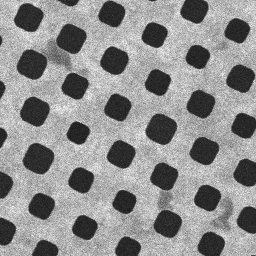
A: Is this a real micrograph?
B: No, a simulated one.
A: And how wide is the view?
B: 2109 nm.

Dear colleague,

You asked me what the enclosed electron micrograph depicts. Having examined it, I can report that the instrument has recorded a regular array of holes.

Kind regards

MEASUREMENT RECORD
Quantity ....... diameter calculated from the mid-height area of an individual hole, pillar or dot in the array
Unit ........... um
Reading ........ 0.218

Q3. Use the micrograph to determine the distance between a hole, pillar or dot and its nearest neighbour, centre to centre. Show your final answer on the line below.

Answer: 388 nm